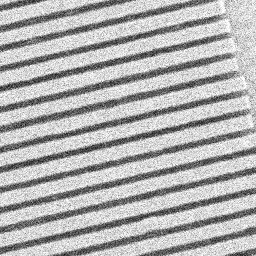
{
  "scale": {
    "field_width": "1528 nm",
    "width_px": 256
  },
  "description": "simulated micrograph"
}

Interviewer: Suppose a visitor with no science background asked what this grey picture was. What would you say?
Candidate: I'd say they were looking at parallel lines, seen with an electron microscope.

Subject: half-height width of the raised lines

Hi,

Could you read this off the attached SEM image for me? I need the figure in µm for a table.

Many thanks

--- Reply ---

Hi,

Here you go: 0.0755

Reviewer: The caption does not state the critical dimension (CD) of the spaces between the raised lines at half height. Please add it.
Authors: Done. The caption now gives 6.8 pixels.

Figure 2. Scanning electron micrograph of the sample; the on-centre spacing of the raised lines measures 117 nm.